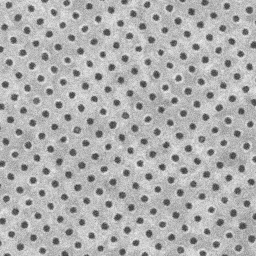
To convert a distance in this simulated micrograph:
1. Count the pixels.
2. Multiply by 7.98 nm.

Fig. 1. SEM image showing a regular array of holes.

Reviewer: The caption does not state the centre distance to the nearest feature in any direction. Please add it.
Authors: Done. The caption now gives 124 nm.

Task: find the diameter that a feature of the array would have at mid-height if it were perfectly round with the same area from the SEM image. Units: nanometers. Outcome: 65.6